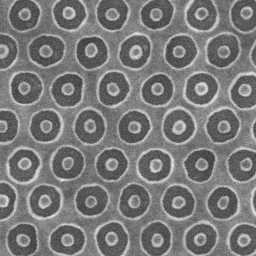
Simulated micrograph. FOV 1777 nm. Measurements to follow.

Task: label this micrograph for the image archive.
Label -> a regular array of ring-shaped grooves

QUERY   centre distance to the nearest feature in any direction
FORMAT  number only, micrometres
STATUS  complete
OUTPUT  0.288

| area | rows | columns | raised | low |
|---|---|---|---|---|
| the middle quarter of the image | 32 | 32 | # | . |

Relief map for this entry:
#####....######.....#######....#
################################
...#######.....#################
....######.....#######....#####.
.....####.......####.......####.
##...####..##...####..###..###..
##...####..###...##...###..###..
##..#####...#...###....#...###..
....#####......#####.......###..
....#####.....######......#####.
...########.###########.########
#####...#########.#########...##
####.....######.....######.....#
###.......####.......####.......
###...##..####...#...####.......
###..###..####..###...###...##..
###...##..###...###..####..###..
###.......####.......####.......
####.....#####......######......
#####...#######...#########...##
.###############################
...#######....########..########
....#####......#####......######
##...###........###........####.
##...###...##...###...##...###..
##...###...##...##....##...###..
.....###........##....##...####.
....#####......####.......#####.
...######.....#####.......#####.
################################
#####....#######...########...##
####......#####......#####.....#